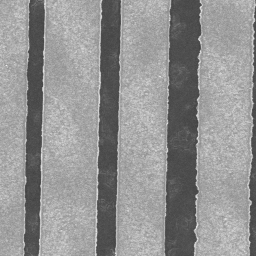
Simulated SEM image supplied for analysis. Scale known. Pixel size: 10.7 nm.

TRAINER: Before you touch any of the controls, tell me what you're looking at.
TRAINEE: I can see one or a few lines or trenches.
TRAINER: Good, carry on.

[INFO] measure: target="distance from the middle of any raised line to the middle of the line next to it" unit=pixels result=77.2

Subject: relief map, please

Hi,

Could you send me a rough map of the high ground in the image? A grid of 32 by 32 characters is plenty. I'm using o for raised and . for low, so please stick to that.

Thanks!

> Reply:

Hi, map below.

oooo..ooooooo..oooooo....ooooooo
oooo..ooooooo..oooooo....ooooooo
oooo..ooooooo..oooooo....ooooooo
oooo..ooooooo..oooooo....ooooooo
oooo..ooooooo..oooooo....ooooooo
oooo..ooooooo..oooooo....ooooooo
oooo..ooooooo..oooooo....ooooooo
oooo..oooooo...oooooo....ooooooo
ooo..ooooooo...oooooo....ooooooo
ooo..oooooooo..oooooo....ooooooo
ooo..oooooooo..oooooo....ooooooo
ooo..ooooooo...oooooo....oooooo.
ooo..ooooooo...oooooo....ooooooo
ooo..ooooooo...oooooo....ooooooo
ooo..ooooooo...oooooo....oooooo.
ooo..ooooooo...oooooo....ooooooo
ooo..ooooooo...oooooo....ooooooo
ooo..ooooooo...oooooo....oooooo.
ooo..ooooooo...oooooo....oooooo.
ooo..ooooooo...oooooo....ooooooo
ooo..ooooooo...oooooo....oooooo.
ooo..ooooooo...oooooo....oooooo.
ooo..ooooooo...oooooo....oooooo.
ooo..ooooooo...oooooo....oooooo.
ooo..ooooooo...oooooo....oooooo.
ooo..ooooooo...oooooo...ooooooo.
ooo..ooooooo...oooooo...ooooooo.
ooo..ooooooo...oooooo....oooooo.
ooo..ooooooo...oooooo....oooooo.
ooo..ooooooo...oooooo....oooooo.
ooo..ooooooo...oooooo...ooooooo.
ooo..ooooooo..ooooooo...ooooooo.